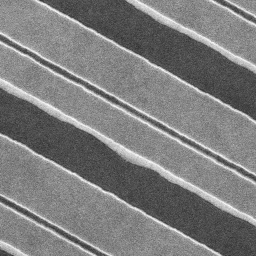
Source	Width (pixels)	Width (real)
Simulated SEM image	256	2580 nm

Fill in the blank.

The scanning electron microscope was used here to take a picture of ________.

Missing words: lines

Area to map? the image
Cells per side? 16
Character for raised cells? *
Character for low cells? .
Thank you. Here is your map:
***......*******
*****......*****
*******......***
*********......*
**********......
.***********....
...***********..
....************
......**********
**......********
****......******
******......****
********.....***
*********......*
***********.....
.************...